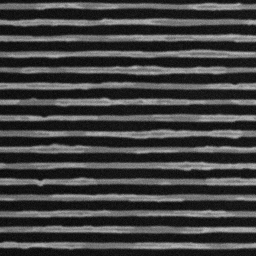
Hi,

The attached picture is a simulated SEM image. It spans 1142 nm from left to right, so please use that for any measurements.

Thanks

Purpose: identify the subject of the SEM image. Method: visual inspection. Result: parallel lines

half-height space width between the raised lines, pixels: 10.2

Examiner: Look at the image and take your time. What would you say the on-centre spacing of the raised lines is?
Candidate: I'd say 15.9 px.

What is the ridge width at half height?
22.8 nanometers